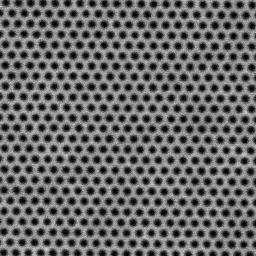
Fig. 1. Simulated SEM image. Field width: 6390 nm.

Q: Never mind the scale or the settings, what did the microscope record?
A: a regular array of holes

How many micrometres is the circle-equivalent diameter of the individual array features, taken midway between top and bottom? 0.211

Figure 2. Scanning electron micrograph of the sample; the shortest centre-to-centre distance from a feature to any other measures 293 nanometers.